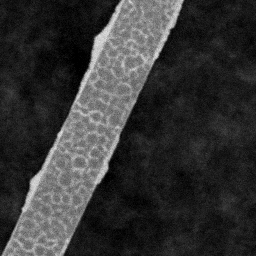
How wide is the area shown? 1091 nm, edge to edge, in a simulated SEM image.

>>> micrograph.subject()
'one or a few lines or trenches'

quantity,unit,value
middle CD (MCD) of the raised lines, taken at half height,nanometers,233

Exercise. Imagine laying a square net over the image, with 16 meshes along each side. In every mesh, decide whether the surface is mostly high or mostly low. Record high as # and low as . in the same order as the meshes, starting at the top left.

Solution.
.......####.....
.......####.....
......####......
......####......
.....####.......
.....####.......
.....###........
....####........
....###.........
...####.........
...####.........
..####..........
..####..........
.####...........
.####...........
####............